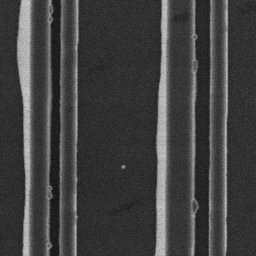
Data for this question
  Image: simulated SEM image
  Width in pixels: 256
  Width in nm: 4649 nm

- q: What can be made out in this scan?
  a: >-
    lines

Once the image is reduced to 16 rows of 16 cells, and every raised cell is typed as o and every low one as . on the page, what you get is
..ooo.....oooo..
..ooo.....oooo..
..ooo.....oooo..
..ooo.....oooo..
..ooo.....oooo..
..ooo.....oooo..
..ooo.....oooo..
..ooo.....oooo..
..ooo.....oooo..
..ooo.....oooo..
..ooo.....oooo..
..ooo.....oooo..
..ooo.....oooo..
..ooo.....oooo..
..ooo.....oooo..
..ooo.....oooo..